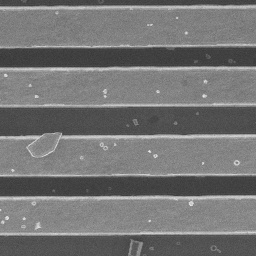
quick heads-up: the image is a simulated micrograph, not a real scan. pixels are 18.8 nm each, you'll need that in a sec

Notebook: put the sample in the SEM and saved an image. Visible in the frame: lines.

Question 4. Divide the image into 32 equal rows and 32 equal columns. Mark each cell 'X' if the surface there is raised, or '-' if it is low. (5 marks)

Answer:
--------------------------------
XXXXXXXXXXXXXXXXXXXXXXXXXXXXXXXX
XXXXXXXXXXXXXXXXXXXXXXXXXXXXXXXX
XXXXXXXXXXXXXXXXXXXXXXXXXXXXXXXX
XXXXXXXXXXXXXXXXXXXXXXXXXXXXXXXX
XXXXXXXXXXXXXXXXXXXXXXXXXXXXXXXX
--------------------------------
--------------------------------
XXXXXXXXXXXXXXXXXXXXXXXXXXXXXXXX
XXXXXXXXXXXXXXXXXXXXXXXXXXXXXXXX
XXXXXXXXXXXXXXXXXXXXXXXXXXXXXXXX
XXXXXXXXXXXXXXXXXXXXXXXXXXXXXXXX
XXXXXXXXXXXXXXXXXXXXXXXXXXXXXXXX
--------------------------------
--------------------------------
--------------------------------
--------------------------------
XXXXXXXXXXXXXXXXXXXXXXXXXXXXXXXX
XXXXXXXXXXXXXXXXXXXXXXXXXXXXXXXX
XXXXXXXXXXXXXXXXXXXXXXXXXXXXXXXX
XXXXXXXXXXXXXXXXXXXXXXXXXXXXXXXX
XXXXXXXXXXXXXXXXXXXXXXXXXXXXXXXX
--------------------------------
--------------------------------
------------------XXX----XXXXXXX
XXXXXXXXXXXXXXXXXXXXXXXXXXXXXXXX
XXXXXXXXXXXXXXXXXXXXXXXXXXXXXXXX
XXXXXXXXXXXXXXXXXXXXXXXXXXXXXXXX
XXXXXXXXXXXXXXXXXXXXXXXXXXXXXXXX
--------------------------------
--------------------------------
--------------------------------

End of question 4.